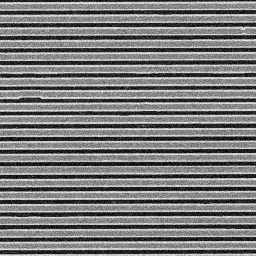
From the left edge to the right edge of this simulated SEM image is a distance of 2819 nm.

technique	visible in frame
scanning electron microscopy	parallel lines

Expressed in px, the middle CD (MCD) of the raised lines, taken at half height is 6.75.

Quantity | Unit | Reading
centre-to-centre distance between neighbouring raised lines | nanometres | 139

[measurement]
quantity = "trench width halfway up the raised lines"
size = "63.3 nm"